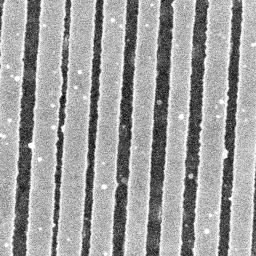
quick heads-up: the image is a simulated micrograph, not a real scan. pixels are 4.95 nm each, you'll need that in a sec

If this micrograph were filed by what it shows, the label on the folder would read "parallel lines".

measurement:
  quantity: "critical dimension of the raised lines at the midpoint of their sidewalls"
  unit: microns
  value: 0.113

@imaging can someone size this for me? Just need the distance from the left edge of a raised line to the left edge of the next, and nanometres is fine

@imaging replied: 166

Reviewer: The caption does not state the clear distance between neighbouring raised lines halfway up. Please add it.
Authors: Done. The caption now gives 0.0606 micrometres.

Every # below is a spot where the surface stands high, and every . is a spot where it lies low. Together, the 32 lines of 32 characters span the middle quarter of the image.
.######..######...#####....#####
.######..######...#####....#####
.######..######...#####....#####
.######..######..######....####.
.######..#####...######....#####
.######..#####....#####....#####
.######..#####...######....#####
.######..#####...######...#####.
.#####...#####...######...#####.
.#####...#####...######...#####.
.#####...#####...#####....#####.
######..######...#####....#####.
######...#####...#####....#####.
######...#####...#####....#####.
######..######...#####....#####.
######..######...#####....#####.
######..######...#####....#####.
######..######...#####....#####.
######..######...#####....#####.
######..######...#####....####..
######..#####....#####....####..
######..#####....#####....####..
######..#####....#####....####..
######..#####...######....####..
######..#####...######...#####..
######..#####...######...#####..
#####...#####...#####....#####..
#####...#####...#####....#####..
#####...#####...#####....#####..
#####..######...#####....#####..
#####...#####...#####....#####..
#####..######...#####....#####..